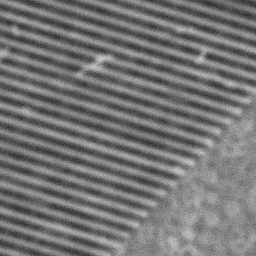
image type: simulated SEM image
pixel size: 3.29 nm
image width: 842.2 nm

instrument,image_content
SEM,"parallel lines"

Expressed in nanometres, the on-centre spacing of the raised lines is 41.4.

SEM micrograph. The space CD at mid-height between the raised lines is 26.8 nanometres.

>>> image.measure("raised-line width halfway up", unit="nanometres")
14.6